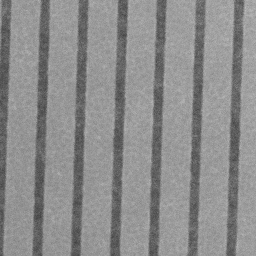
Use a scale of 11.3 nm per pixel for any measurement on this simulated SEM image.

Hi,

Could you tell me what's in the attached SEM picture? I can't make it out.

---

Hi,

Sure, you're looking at parallel lines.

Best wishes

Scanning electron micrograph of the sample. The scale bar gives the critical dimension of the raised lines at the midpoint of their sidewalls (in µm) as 0.321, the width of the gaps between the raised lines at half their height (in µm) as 0.119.